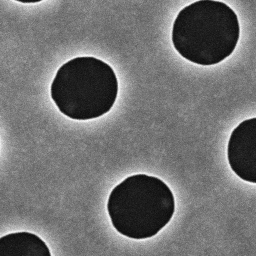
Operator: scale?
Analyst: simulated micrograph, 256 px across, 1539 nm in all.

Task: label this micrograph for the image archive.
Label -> holes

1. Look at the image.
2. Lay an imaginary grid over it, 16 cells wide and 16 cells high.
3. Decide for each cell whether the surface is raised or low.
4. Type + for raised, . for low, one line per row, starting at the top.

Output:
++++++++++++..++
+++++++++++....+
+++++++++++....+
+++++++++++...++
++++...+++++++++
+++....+++++++++
+++....+++++++++
+++++++++++++++.
++++++++++++++..
++++++++++++++..
++++++++++++++..
+++++++...++++++
+++++++....+++++
+++++++....+++++
+++++++...++++++
...+++++++++++++